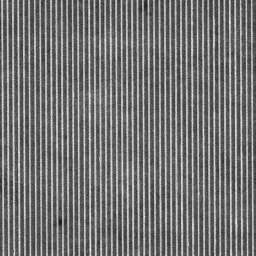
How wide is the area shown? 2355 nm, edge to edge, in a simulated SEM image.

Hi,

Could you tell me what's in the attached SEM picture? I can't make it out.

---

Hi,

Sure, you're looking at parallel lines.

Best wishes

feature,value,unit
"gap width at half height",36.8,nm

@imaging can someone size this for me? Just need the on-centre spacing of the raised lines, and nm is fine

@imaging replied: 49.9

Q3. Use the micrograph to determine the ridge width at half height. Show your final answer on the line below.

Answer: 12.6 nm